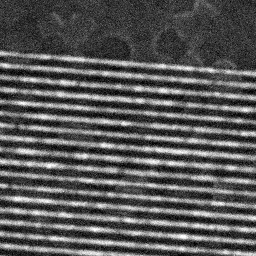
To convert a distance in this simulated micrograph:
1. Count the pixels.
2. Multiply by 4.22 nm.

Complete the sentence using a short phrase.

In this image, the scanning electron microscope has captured parallel lines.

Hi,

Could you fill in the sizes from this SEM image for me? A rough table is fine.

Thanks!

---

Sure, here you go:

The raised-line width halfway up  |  13.7 nanometers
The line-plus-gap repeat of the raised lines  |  50.7 nm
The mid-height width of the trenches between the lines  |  34.7 nm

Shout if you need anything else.